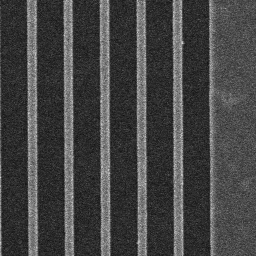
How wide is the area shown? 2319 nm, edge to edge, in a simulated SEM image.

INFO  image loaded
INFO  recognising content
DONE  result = parallel lines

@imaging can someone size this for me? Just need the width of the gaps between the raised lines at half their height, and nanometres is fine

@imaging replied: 254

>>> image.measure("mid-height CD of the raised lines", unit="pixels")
8.5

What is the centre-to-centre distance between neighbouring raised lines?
330 nm